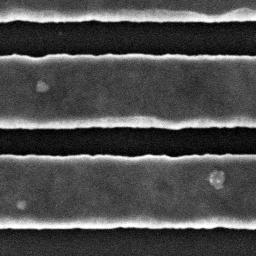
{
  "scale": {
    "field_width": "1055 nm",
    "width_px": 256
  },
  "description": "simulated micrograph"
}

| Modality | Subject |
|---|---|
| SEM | lines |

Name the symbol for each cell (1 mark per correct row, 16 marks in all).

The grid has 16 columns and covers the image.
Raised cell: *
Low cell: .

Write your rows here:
****************
................
................
...********.....
****************
****************
****************
****************
................
................
****************
****************
****************
****************
................
................